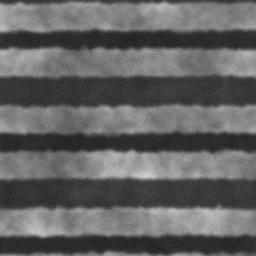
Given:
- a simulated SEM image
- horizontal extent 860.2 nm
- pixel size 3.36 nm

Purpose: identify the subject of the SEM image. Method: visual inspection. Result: lines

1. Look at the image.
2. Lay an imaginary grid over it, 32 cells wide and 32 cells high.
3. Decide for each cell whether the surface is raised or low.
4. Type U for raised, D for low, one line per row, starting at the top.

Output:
UDUDDUUUUUUUUDUUUUUUUUUUUUUUUUUU
UUUUUUUUUUUUUUUUUUUUUUUUUUUUUUUU
UUUUUUUUUUUUUUUUUUUUUUUUUUUUUUUU
UUUUUUUUUUUUUUUUUUUUUUUUUUUUUUUU
DDDDDDDDDDDDDDDDDDDDDDDDDDDDDDDD
DDDDDDDDDDDDDDDDDDDDDDDDDDDDDDDD
UUUUUUUUUUUUUUUUUUUUUUUUUUUUUUUU
UUUUUUUUUUUUUUUUUUUUUUUUUUUUUUUU
UUUUUUUUUUUUUUUUUUUUUUUUUUUUUUUU
DDDDUUUUDDUDUUDUDDDDUDDDDDDDDDUD
DDDDDDDDDDDDDDDDDDDDDDDDDDDDDDDD
DDDDDDDDDDDDDDDDDDDDDDDDDDDDDDDD
DDDDDDDDDDDDDDDDDDDDDDDDDDDDDDDD
UUUDUUUUUUUUUUUUUUUUUUUUUUUUUUUU
UUUUUUUUUUUUUUUUUUUUUUUUUUUUUUUU
UUUUUUUUUUUUUUUUUUUUUUUUUUUUUUUU
DUUUUUUUUUUUUUUUUUUUUDDUDDDUDUUU
DDDDDDDDDDDDDDDDDDDDDDDDDDDDDDDD
DDDDDDDDDDDDDDDDDDDDDDDDDDDDDDDD
UUUUUUUUUUUUUUUUUUUUUUUUUUUUUUUU
UUUUUUUUUUUUUUUUUUUUUUUUUUUUUUUU
UUUUUUUUUUUUUUUUUUUUUUUUUUUUUUUU
DDDDDDDDDDDDDDDDDDDDDDDDDDDDDDDD
DDDDDDDDDDDDDDDDDDDDDDDDDDDDDDDD
DDDDDDDDDDDDDDDDDDDDDDDDDDDDDDDD
DDDDDDDDDDDDDDDDDDDDDDDDDDDDDDDD
UUUUUUUUUUUUUUUUUUUUUUUUUUUUUUUU
UUUUUUUUUUUUUUUUUUUUUUUUUUUUUUUU
UUUUUUUUUUUUUUUUUUUUUUUUUUUUUUUU
DDDDDUDDDDDDDDDDDDDUDDDDDDDUDDDD
DDDDDDDDDDDDDDDDDDDDDDDDDDDDDDDD
DDDDDDDDDDDDDDDDDDDDDDDDDDDDDDDD